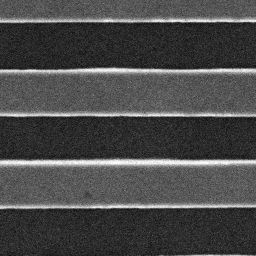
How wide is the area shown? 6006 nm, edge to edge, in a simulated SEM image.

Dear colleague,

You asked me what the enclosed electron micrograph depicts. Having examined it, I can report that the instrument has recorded lines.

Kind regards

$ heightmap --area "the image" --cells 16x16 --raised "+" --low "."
++++++++++++++++
................
................
................
++++++++++++++++
++++++++++++++++
++++++++++++++++
................
................
................
++++++++++++++++
++++++++++++++++
++++++++++++++++
................
................
................